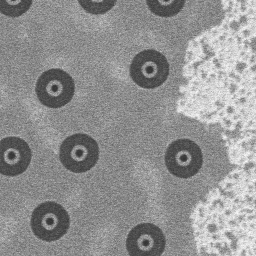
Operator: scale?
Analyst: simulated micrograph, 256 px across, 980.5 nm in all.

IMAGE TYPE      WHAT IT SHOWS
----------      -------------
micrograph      ring-shaped grooves with a dot in the middle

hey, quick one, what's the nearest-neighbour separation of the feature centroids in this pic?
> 74.4 px